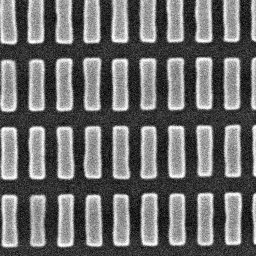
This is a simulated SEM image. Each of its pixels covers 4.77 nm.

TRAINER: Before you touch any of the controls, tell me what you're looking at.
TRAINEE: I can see groups of lines, slits or small figures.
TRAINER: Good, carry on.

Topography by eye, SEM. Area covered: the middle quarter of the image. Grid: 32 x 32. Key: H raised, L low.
HHLLLHHHHLLLHHHLLLLHHHHLLLHHHHLL
HHLLLHHHHLLLHHHLLLLHHHHLLLHHHLLL
HHLLLHHHHLLLHHHLLLLHHHHLLLHHHHLL
HHLLLHHHHLLLHHHLLLLHHHHLLLHHHHLL
HHLLLHHHHLLLLHHLLLLLHHHLLLHHHHLL
HHLLLHHHHLLLLHHHLLLLHHHLLLHHHHLL
HHLLLHHHHLLLLHHHLLLLHHHLLLHHHHLL
HHLLLHHHHLLLLHHHLLLLHHHLLLHHHHLL
HHLLLHHHHLLLLHHHLLLLHHHLLLHHHHLL
HHLLLHHHHLLLLHHHLLLHHHHLLLHHHHLL
HHLLLHHHHLLLHHHHLLLHHHHLLLHHHHLL
LLLLLLLLLLLLLLLLLLLLLLLLLLLLLLLL
LLLLLLLLLLLLLLLLLLLLLLLLLLLLLLLL
LLLLLLLLLLLLLLLLLLLLLLLLLLLLLLLL
LLLLLLLLLLLLLLLLLLLLLLLLLLLLLLLL
LLLLLLLLLLLLLLLLLLLLLLLLLLLLLLLL
HHLLLHHHHLLLLHHHLLLLHHHLLLHHHHLL
HHLLLHHHHLLLLHHHLLLLHHHLLLHHHHLL
HHLLLHHHHLLLLHHHLLLLHHHLLLHHHHLL
HHLLLLHHHLLLLHHHLLLLHHHLLLHHHHLL
HHLLLLHHHLLLLHHHLLLLHHHLLLHHHHLL
HHLLLLHHHLLLLHHHLLLLHHHLLLHHHHLL
HHLLLHHHHLLLLHHHLLLLHHHLLLHHHHLL
HHLLLHHHHLLLLHHHLLLLHHHLLLHHHHLL
HHLLLHHHHLLLLHHHLLLLHHHLLLHHHHLL
HHLLLHHHHLLLLHHHLLLLHHHLLLHHHHLL
HHLLLHHHHLLLLHHHLLLLHHHLLLHHHHLL
HHLLLHHHHLLLLHHHLLLHHHHLLLHHHHLL
LLLLLLLLLLLLLLLLLLLLLLLLLLLLLLLL
LLLLLLLLLLLLLLLLLLLLLLLLLLLLLLLL
LLLLLLLLLLLLLLLLLLLLLLLLLLLLLLLL
LLLLLLLLLLLLLLLLLLLLLLLLLLLLLLLL